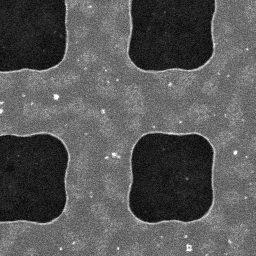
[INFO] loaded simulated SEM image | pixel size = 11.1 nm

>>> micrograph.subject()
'holes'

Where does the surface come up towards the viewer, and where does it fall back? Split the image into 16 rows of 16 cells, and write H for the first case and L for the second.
LLLLHHHHLLLLLHHH
LLLLHHHHLLLLLHHH
LLLLHHHHLLLLLHHH
LLLLHHHHLLLLLHHH
LHHHHHHHHHHHHHHH
HHHHHHHHHHHHHHHH
HHHHHHHHHHHHHHHH
HHHHHHHHHHHHHHHH
LLLHHHHHHLLLLHHH
LLLLHHHHLLLLLHHH
LLLLHHHHLLLLLHHH
LLLLHHHHLLLLLHHH
LLLLHHHHLLLLLHHH
LLLLHHHHLLLLLHHH
HHHHHHHHHHHHHHHH
HHHHHHHHHHHHHHHH